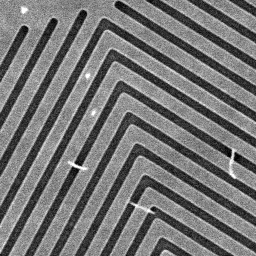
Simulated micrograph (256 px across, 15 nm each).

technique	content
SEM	groups of lines, slits or small figures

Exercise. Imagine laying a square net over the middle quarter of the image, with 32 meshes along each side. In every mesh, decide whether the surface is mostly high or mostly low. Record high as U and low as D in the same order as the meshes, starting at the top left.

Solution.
UUUDDUUUUDDDUUUDDDDUUUUUUDDDDDUU
UUDDDUUUUDDUUUUUUDDDDUUUUUUDDDDU
UUDDUUUUDDDUUUUUUUDDDDUUUUUUUDDD
UDDDUUUUDDUUUUUUUUUUDDDDUUUUUUDD
UDDUUUUDDUUUUDDUUUUUUUDDDDUUUUUU
DDDUUUDDDUUUUDDDDUUUUUUDDDDUUUUU
DDUUUUDDDUUUDDDDDDUUUUUUDDDDDUUU
DDUUUDDDUUUUDDUUDDDDUUUUUUDDDDDU
DUUUUDDUUUUDDDUUUDDDDDUUUUUUDDDD
DUUUDDDUUUUDDUUUUUUDDDDUUUUUUDDD
UUUUDDUUUUDDDUUUUUUUUDDDDUUUUUUD
UUUDDDUUUDDDUUUUUUUUUUDDDDUUUUUU
UUUDDUUUUDDDUUUDDDUUUUUDDDDDUUUU
UUDDDUUUUDDUUUUDDDDUUUUUUDDDDDUU
UUDDUUUUDDUUUUDDDDDDDUUUUUUDDDDU
UDDDUUUDDDUUUUDDUUDDDDUUUUUUDDDD
UDDUUUUDDUUUUDDDUUUUDDDDUUUUUUDD
DDDUUUDDDUUUUDDUUUUUUDDDDDUUUUUU
DDUUUUDDUUUUDDDUUUUUUUUDDDDUUUUU
DDUUUDDDUUUUDDUUUUUUUUUUDDDDUUUU
DUUUUDDUUUUDDUUUUDDDUUUUUUDDDDUU
UUUUDDDUUUDDDUUUUDDDDUUUUUUUDDDD
UUUUDDUUUUDDUUUUDDDDDDDUUUUUUDDD
UUUDDDUUUDDDUUUUDDUUDDDDDUUUUUUD
UUUDDUUUUDDDUUUDDDUUUUDDDDUUUUUU
UUUDDUUUDDDUUUUDDUUUUUUDDDDDUUUU
UDDDUUUUDDUUUUDDDUUUUUUUUDDDDUUU
UDDUUUUDDDUUUDDDUUUUUUUUUUUDDDDU
DDDUUUUDDUUUUDDDUUUDDDUUUUUUDDDD
DDUUUUDDDUUUDDDUUUUDDDDDUUUUUUDD
DDUUUUDDUUUUDDDUUUDDDDDDDUUUUUUU
DUUUUDDDUUUDDDUUUUDDUUDDDDDUUUUU